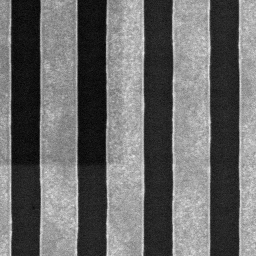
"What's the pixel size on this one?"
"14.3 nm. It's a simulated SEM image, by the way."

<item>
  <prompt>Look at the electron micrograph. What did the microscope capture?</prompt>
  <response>wiring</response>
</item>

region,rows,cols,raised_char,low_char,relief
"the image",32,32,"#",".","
#....#####...#####....####....##
#....#####...#####....####....##
#....#####...#####....####....##
#....#####...#####....####....##
#....#####...#####....####....##
#....#####...#####....####....##
#....#####...#####....####....##
#....#####...#####....####....##
#....#####...#####....####....##
#....#####...#####....####....##
#....#####...#####....####....##
#....#####...#####....####....##
#....#####...#####....####....##
#....#####...#####....####....##
#....#####...#####....####....##
#....#####...#####....####....##
#....#####...#####....####....##
#....#####...#####....####....##
#....#####...#####....####....##
#....#####...#####....####....##
#....#####...#####....####....##
#....#####...#####....####....##
#....#####...#####....####....##
#....#####...#####....####....##
#....#####...#####....####....##
#....#####....####....####....##
#....#####...#####....####....##
#....#####...#####....####....##
#....#####...#####....####....##
#....#####...#####....####....##
#....#####...#####....####....##
#....#####...#####....####....##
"